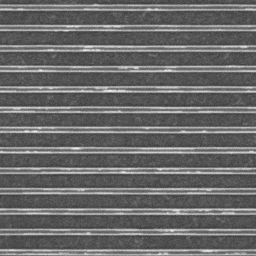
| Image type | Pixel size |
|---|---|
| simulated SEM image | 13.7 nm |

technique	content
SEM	parallel lines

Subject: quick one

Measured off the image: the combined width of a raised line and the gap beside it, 280 nm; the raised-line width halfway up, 70.2 nanometres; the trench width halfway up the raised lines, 15.2 px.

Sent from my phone